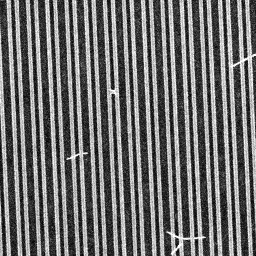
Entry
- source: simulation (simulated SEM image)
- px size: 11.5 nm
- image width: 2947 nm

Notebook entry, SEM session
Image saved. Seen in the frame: parallel lines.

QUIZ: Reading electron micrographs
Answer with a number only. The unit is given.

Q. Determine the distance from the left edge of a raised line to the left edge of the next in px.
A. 9.6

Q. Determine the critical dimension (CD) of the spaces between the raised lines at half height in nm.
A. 61.8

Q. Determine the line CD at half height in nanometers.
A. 34.5